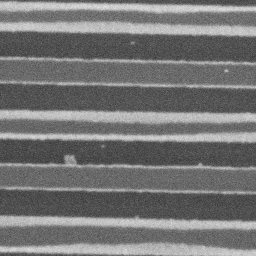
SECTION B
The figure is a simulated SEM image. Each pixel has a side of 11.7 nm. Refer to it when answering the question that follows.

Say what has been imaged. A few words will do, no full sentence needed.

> lines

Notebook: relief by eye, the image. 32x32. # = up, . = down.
................................
################################
################################
##.#############################
................................
................................
................................
##############..................
################################
################################
.......#########################
................................
................................
................................
################.#..............
################################
################################
................................
................................
................................
................................
################################
################################
################################
................................
................................
................................
...#............................
################################
################################
################################
.........................#######